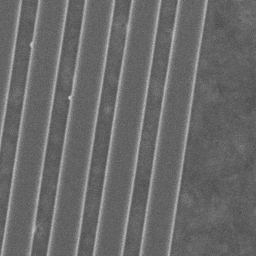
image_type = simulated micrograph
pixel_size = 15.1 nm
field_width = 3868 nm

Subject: parallel lines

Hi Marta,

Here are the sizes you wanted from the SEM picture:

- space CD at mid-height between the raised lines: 262 nm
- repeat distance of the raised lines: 45.8 pixels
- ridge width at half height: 428 nm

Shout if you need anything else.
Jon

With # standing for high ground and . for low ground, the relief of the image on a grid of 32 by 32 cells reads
###..###...###..####..####......
###..###..####..####..####......
##..####..####..####..####......
##..####..####..####..###.......
##..####..####..###...###.......
##..####..####..###..####.......
##..####..###...###..####.......
##..###...###..####..####.......
#...###..####..####..####.......
#..####..####..####..###........
#..####..####..####..###........
#..####..####..###..####........
#..####..###...###..####........
#..###...###..####..####........
#..###...###..####..####........
...###..####..####..####........
..####..####..####..###.........
..####..####..###...###.........
..####..####..###..####.........
..####..###...###..####.........
..###...###..####..####.........
..###..####..####..####.........
..###..####..####..####.........
.####..####..####..###..........
.####..####..###...###..........
.####..####..###..####..........
.####..###..####..####..........
.###...###..####..####..........
.###..####..####..####..........
.###..####..####..####..........
####..####..####..###...........
####..####..###...###...........